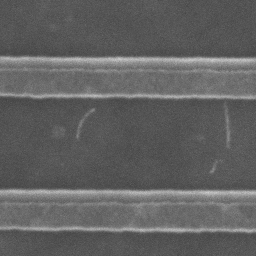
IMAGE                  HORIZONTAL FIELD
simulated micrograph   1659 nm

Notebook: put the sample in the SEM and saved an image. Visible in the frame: lines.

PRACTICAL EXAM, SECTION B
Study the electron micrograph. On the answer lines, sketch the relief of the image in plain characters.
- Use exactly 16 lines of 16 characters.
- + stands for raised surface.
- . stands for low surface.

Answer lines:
................
................
................
................
++++++++++++++++
++++++++++++++++
................
................
................
................
................
................
++++++++++++++++
++++++++++++++++
................
................